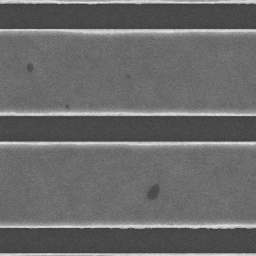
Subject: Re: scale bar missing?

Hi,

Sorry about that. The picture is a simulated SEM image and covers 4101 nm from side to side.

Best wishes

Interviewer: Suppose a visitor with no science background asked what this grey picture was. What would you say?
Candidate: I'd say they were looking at lines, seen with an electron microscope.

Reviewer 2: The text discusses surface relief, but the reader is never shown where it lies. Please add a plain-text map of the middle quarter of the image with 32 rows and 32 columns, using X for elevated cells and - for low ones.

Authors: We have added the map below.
XXXXXXXXXXXXXXXXXXXXXXXXXXXXXXXX
XXXXXXXXXXXXXXXXXXXXXXXXXXXXXXXX
XXXXXXXXXXXXXXXXXXXXXXXXXXXXXXXX
XXXXXXXXXXXXXXXXXXXXXXXXXXXXXXXX
XXXXXXXXXXXXXXXXXXXXXXXXXXXXXXXX
XXXXXXXXXXXXXXXXXXXXXXXXXXXXXXXX
XXXXXXXXXXXXXXXXXXXXXXXXXXXXXXXX
XXXXXXXXXXXXXXXXXXXXXXXXXXXXXXXX
XXXXXXXXXXXXXXXXXXXXXXXXXXXXXXXX
XXXXXXXXXXXXXXXXXXXXXXXXXXXXXXXX
XXXXXXXXXXXXXXXXXXXXXXXXXXXXXXXX
XXXXXXXXXXXXXXXXXXXXXXXXXXXXXXXX
XXXXXXXXXXXXXXXXXXXXXXXXXXXXXXXX
--------------------------------
--------------------------------
--------------------------------
--------------------------------
--------------------------------
--------------------------------
--------------------------------
XXXXXXXXXXXXXXXXXXXXXXXXXXXXXXXX
XXXXXXXXXXXXXXXXXXXXXXXXXXXXXXXX
XXXXXXXXXXXXXXXXXXXXXXXXXXXXXXXX
XXXXXXXXXXXXXXXXXXXXXXXXXXXXXXXX
XXXXXXXXXXXXXXXXXXXXXXXXXXXXXXXX
XXXXXXXXXXXXXXXXXXXXXXXXXXXXXXXX
XXXXXXXXXXXXXXXXXXXXXXXXXXXXXXXX
XXXXXXXXXXXXXXXXXXXXXXXXXXXXXXXX
XXXXXXXXXXXXXXXXXXXXXXXXXXXXXXXX
XXXXXXXXXXXXXXXXXXXXXXXXXXXXXXXX
XXXXXXXXXXXXXXXXXXXXXXXXXXXXXXXX
XXXXXXXXXXXXXXXXXXXXXXXXXXXXXXXX